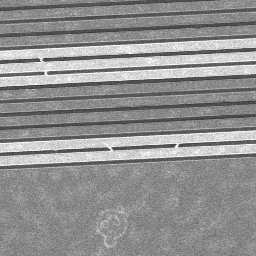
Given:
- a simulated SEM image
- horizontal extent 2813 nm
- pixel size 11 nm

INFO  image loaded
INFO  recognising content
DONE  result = parallel lines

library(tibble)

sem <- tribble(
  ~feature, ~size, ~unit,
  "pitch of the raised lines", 145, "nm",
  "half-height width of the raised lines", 8.86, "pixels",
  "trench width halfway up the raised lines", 0.0425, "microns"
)